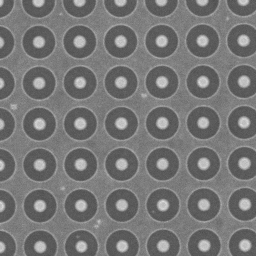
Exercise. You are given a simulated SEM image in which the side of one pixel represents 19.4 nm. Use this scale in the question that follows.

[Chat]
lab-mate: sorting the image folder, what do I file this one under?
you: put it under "an array of small figures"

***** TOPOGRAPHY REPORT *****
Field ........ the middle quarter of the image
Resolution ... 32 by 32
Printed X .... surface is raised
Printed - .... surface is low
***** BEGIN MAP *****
XXXXXXXXXXXXX--XXXXXXXX---XXXXXX
X------XXXX------XXXXX-----XXXXX
X-------XXX-------XXX-------XXX-
--------XX--------XXX---X----XX-
---XX---XX---XX---XX---XXX---X--
---XX---XX---XX---XX----X----XX-
--------XX--------XXX-------XXX-
X------XXXX------XXXXX------XXXX
XX---XXXXXXXX---XXXXXXX---XXXXXX
XXXXXXXXXXXXXXXXXXXXXXXXXXXXXXXX
XXXXXXXXXXXXXXXXXXXXXXXXXXXXXXXX
XX----XXXXXX-----XXXXX-----XXXXX
X------XXXX-------XXX-------XXX-
--------XX--------XXX--------XX-
---XX---XX---XXX--XX----XX---XX-
---XX---XX---XX----X----XX---XX-
--------XXX-------XXX-------XXX-
X------XXXX-------XXX-------XXXX
XX----XXXXXX-----XXXXXX---XXXXXX
XXXXXXXXXXXXXXXXXXXXXXXXXXXXXXXX
XXXXXXXXXXXXXXXXXXXXXXXXXXXXXXXX
XX-----XXXXX-----XXXXX-----XXXXX
X------XXXX-------XXX-------XXXX
--------XXX-------XXX--------XX-
---XX---XX----X----X----XX---XX-
---XX---XX---XX----X----XX---XX-
--------XX--------XXX--------XX-
X-------XXX-------XXX-------XXXX
XX-----XXXXX-----XXXXX-----XXXXX
XXXXXXXXXXXXXXXXXXXXXXXXXXXXXXXX
XXXXXXXXXXXXXXXXXXXXXXXXXXXXXXXX
XXX---XXXXXXX---XXXXXXX----XXXXX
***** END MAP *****